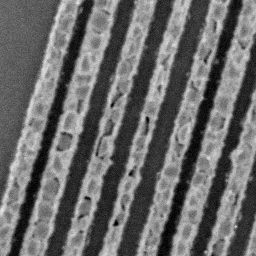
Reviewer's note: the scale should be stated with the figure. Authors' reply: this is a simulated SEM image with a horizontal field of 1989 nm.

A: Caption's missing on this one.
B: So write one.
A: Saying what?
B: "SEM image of parallel lines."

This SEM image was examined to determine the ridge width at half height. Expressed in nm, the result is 131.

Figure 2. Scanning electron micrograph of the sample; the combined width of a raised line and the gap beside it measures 274 nm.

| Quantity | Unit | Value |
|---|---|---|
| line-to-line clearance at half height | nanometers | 144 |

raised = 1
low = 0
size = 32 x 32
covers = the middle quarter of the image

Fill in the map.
00011111000000111100000111000000
00011111000001111100000111000000
00011111000001111000000111000000
00111111000001111000001111000000
00111110000001111000001111000001
00111110000011111000001110000001
01111110000011110000001110000001
01111100000011110000011110000011
01111100000111110000011110000001
11111100000111100000111100000011
11111100000111100000111100000011
11111000000111100000111000000111
11111000001111100000111000000111
11110000001111000000111000001111
11110000001011000001110000001111
11110000011101000001111000001111
11110000011010000001110000001111
11110000011010000011110000011111
11100000111110000011110000011110
11100000111100000011100000011110
11100000111100000111100000011110
11000000111100000111100000111110
11000001111100000111000000111100
11000001111000000111000000111100
10000001111100001111000000111000
10000011111000001110000001111000
10000011110000001110000001111000
10000011110000001110000001111000
00000011100000011110000011111000
00000111100000111100000011110000
00000111100000111100000011110000
00001111100000111000000111100000